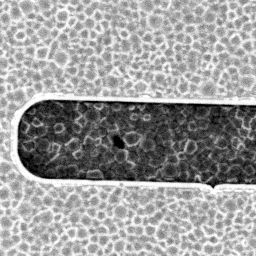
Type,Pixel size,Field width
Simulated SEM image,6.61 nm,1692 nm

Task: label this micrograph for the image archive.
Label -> one or a few lines or trenches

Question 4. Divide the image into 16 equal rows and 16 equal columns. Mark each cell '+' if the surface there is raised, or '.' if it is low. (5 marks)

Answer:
++++++++++++++++
++++++++++++++++
++++++++++++++++
++++++++++++++++
++++++++++++++++
++++++++++++++++
++..............
+...............
+...............
+...............
+...............
+++++++++.......
++++++++++++++++
++++++++++++++++
++++++++++++++++
++++++++++++++++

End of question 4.